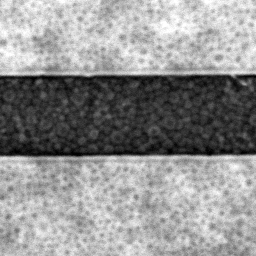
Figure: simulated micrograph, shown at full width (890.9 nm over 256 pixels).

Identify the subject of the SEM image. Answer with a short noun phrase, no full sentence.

one or a few lines or trenches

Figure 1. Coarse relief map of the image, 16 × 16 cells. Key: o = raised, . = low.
oooooooooooooooo
oooooooooooooooo
oooooooooooooooo
oooooooooooooooo
oooooooooooooooo
................
................
................
................
................
oooooooooooooooo
oooooooooooooooo
oooooooooooooooo
oooooooooooooooo
oooooooooooooooo
oooooooooooooooo